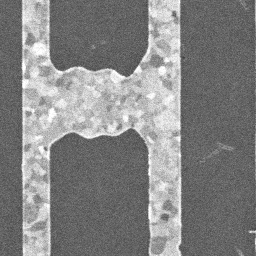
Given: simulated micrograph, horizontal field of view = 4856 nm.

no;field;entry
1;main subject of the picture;one or a few lines or trenches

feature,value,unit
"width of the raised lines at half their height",553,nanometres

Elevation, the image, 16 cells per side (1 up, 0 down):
0110000001100000
0110000001100000
0110000001100000
0110000001100000
0111111011100000
0111111111100000
0111111111100000
0111111111100000
0111010001100000
0110000001100000
0110000001100000
0110000001100000
0110000001100000
0110000001100000
0110000001100000
0110000001100000